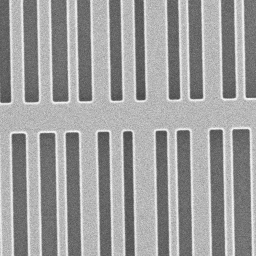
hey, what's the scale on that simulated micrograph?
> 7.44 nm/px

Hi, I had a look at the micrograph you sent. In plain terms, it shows groups of lines, slits or small figures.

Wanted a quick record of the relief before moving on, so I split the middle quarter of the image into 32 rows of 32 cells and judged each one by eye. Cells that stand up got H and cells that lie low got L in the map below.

LHHLLLLHHHHLLLLHHHLLHHHHHHLLLHHL
LHHLLLLHHHHLLLLHHHLLHHHHHHLLLHHL
LHHLLLLHHHHLLLLHHHLLHHHHHHLLLHHL
LHHLLLLHHHHLLLLHHHLLHHHHHHLLLHHL
LHHLLLLHHHHLLLLHHHLLHHHHHHLLLHHL
LHHLLLLHHHHLLLLHHHLLHHHHHHLLLHHL
LHHLLLLHHHHLLLLHHHLLLHHHHHLLLHHL
LHHLLLLHHHHLLLLHHHLLLHHHHHLLLHHL
LHHHLLLHHHHHLLLHHHLLHHHHHHLLLHHL
LHHHLHHHHHHHHHHHHHHHHHHHHHHHHHHH
HHHHHHHHHHHHHHHHHHHHHHHHHHHHHHHH
HHHHHHHHHHHHHHHHHHHHHHHHHHHHHHHH
HHHHHHHHHHHHHHHHHHHHHHHHHHHHHHHH
HHHHHHHHHHHHHHHHHHHHHHHHHHHHHHHH
HHHHHHHHHHHHHHHHHHHHHHHHHHHHHHHH
HHHHHHHHHHHHHHHHHHHHHHHHHHHHHHHH
HHHHHHHHHHHHHHHHHHHHHHHHHHHHHLLH
LLLLHHHHLLLHHHHLLHHHHHHLLLHHLLLL
LLLLHHHHLLLHHHHLLHHHHHHLLLHHLLLL
LLLLHHHHLLLHHHHLLHHHHHHLLLHHLLLL
LLLLHHHHLLLHHHHLLHHHHHHLLLHHLLLL
LLLLHHHHLLLLHHHLLHHHHHHLLLHHLLLL
LLLLHHHHLLLLHHHLLHHHHHHLLLHHLLLL
LLLLHHHHLLLLHHHLLHHHHHHLLLHHLLLL
LLLLHHHHLLLLHHHLLHHHHHHLLLHHLLLL
LLLLHHHHLLLLHHHLLHHHHHHLLLHHLLLL
LLLLHHHHLLLLHHHLLHHHHHHLLLHHLLLL
LLLLHHHHLLLLHHHLLHHHHHHLLLHHLLLL
LLLLHHHHLLLLHHHLLHHHHHHLLLHHLLLL
LLLLHHHHLLLLHHHLLHHHHHHLLLHHLLLL
LLLLHHHHLLLLHHHLLHHHHHHLLLHHLLLL
LLLLHHHHLLLLHHHLLLHHHHHLLLHHLLLL